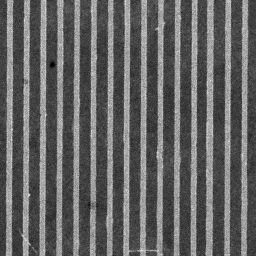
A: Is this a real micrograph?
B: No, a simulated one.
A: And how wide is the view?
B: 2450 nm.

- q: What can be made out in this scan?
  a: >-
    parallel lines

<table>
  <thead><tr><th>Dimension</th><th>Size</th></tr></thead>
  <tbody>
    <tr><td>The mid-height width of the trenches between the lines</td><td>0.115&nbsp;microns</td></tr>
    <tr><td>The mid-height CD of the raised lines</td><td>46.7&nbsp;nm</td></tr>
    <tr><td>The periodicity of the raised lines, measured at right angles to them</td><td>161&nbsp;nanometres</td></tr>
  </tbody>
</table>